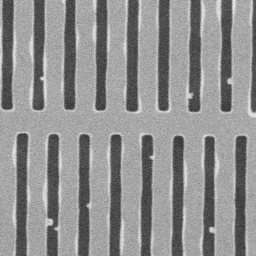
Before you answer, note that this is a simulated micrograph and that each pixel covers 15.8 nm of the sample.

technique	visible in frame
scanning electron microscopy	groups of lines, slits or small figures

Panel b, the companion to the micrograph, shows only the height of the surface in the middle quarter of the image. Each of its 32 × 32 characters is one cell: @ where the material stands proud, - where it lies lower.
---@@@@@---@@@@----@@@@---@@@@@-
---@@@@@---@@@@----@@@@---@@@@@-
---@@@@@---@@@@----@@@@---@@@@@-
---@@@@@---@@@@----@@@@---@@@@@-
---@@@@@--@@@@@----@@@@---@@@@@-
---@@@@@--@@@@@----@@@@---@@@@@-
---@@@@@---@@@@----@@@@---@@@@@-
---@@@@@---@@@@----@@@@---@@@@@-
---@@@@@---@@@@----@@@@---@@@@@-
---@@@@@---@@@@----@@@@---@@@@@-
---@@@@@---@@@@----@@@@---@@@@@-
@-@@@@@@--@@@@@@---@@@@@--@@@@@-
@@@@@@@@@@@@@@@@@@@@@@@@@@@@@@@@
@@@@@@@@@@@@@@@@@@@@@@@@@@@@@@@@
@@@@@@@@@@@@@@@@@@@@@@@@@@@@@@@@
@@@@@@@@@@@@@@@@@@@@@@@@@@@@@@@@
@@@@@@@@@@@@@@@@@@@@@@@@@@@@@@@@
@@@@@-@@@@@@--@@@@@@@@@@@@@@@@@@
@@@@---@@@@@---@@@@---@@@@@---@@
@@@@---@@@@----@@@@---@@@@@---@@
@@@@---@@@@----@@@@---@@@@@---@@
@@@@---@@@@----@@@@---@@@@@---@@
@@@@---@@@@----@@@@---@@@@@---@@
@@@@---@@@@----@@@@---@@@@@---@@
@@@@---@@@@----@@@@---@@@@@---@@
@@@@---@@@@---@@@@@---@@@@@---@@
@@@@--@@@@@---@@@@@---@@@@@---@@
@@@@--@@@@@---@@@@@---@@@@@---@@
@@@@--@@@@@---@@@@@---@@@@@---@@
@@@@--@@@@@---@@@@@---@@@@@---@@
@@@@--@@@@@----@@@@---@@@@@---@@
@@@@---@@@@----@@@@---@@@@@---@@